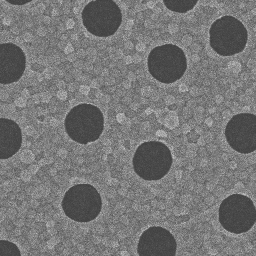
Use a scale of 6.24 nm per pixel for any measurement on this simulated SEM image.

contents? holes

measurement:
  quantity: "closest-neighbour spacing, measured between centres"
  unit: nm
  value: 482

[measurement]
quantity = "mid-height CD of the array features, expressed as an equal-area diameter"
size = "247 nm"